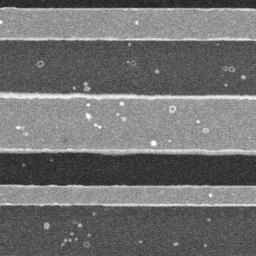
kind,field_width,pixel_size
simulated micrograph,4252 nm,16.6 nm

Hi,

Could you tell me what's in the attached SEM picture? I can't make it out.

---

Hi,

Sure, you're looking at lines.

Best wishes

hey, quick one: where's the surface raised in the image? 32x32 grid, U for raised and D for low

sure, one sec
DDDDDDDDDDDDDDDDDDDDDDDDDDDDDDDD
UUUUUUUUUUUUUUUUUUUUUUUUUUUUUUUU
UUUUUUUUUUUUUUUUUUUUUUUUUUUUUUUU
UUUUUUUUUUUUUUUUUUUUUUUUUUUUUUUU
UUUUUUUUUUUUUUUUUUUUUUUUUUUUUUUU
DDDDDDDDDDDDDDDDDDDDDDDDDDDDDDDD
DDDDDDDDDDDDDDDDDDDDDDDDDDDDDDDD
DDDDDDDDDDDDDDDDDDDDDDDDDDDDDDDD
DDDDDDDDDDDDDDDDDDDDDDDDDDDDDDDD
DDDDDDDDDDDDDDDDDDDDDDDDDDDDDDDD
DDDDDDDDDDDDDDDDDDDDDDDDDDDDDDDD
DDDDDDDDDDDDDDDDDDDDDDDDDDDDDDDD
UUUUUUUUUUUUUUUUUUUUUUUUUUUUUUUU
UUUUUUUUUUUUUUUUUUUUUUUUUUUUUUUU
UUUUUUUUUUUUUUUUUUUUUUUUUUUUUUUU
UUUUUUUUUUUUUUUUUUUUUUUUUUUUUUUU
UUUUUUUUUUUUUUUUUUUUUUUUUUUUUUUU
UUUUUUUUUUUUUUUUUUUUUUUUUUUUUUUU
UUUUUUUUUUUUUUUUUUUUUUUUUUUUUUUU
DDDDDDDDDDDDDDDDDDDDDDDDDDDDDDDD
DDDDDDDDDDDDDDDDDDDDDDDDDDDDDDDD
DDDDDDDDDDDDDDDDDDDDDDDDDDDDDDDD
DDDDDDDDDDDDDDDDDDDDDDDDDDDDDDDD
UUUUUUUUUUUUUUUUUUUUUUUUUUUUUUUU
UUUUUUUUUUUUUUUUUUUUUUUUUUUUUUUU
UUUUUUUUUUUUUUUUUUUUUUUUUUUUUUUU
DDDDDDDDDDDDDDDDDDDDDDDDDDDDDDDD
DDDDDDDDDDDDDDDDDDDDDDDDDDDDDDDD
DDDDDDDDDDDDDDDDDDDDDDDDDDDDDDDD
DDDDDDDDDDDDDDDDDDDDDDDDDDDDDDDD
DDDDDDDDDDDDDDDDDDDDDDDDDDDDDDDD
DDDDDDDDDDDDDDDDDDDDDDDDDDDDDDDD